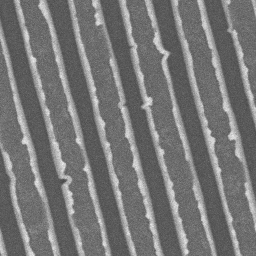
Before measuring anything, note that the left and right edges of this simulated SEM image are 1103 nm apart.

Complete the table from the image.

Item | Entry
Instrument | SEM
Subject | parallel lines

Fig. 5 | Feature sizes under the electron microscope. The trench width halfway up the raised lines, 87.3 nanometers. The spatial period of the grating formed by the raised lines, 0.218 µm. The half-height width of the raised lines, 30.8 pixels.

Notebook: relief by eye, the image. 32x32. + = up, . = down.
..++++...+++...++++...+++...++++
..++++...++++..++++...++++..++++
...+++...++++...+++...++++...+++
...++++..++++...++++..++++...+++
...++++..++++...++++...+++...+++
+..++++...++++..++++...++++..+++
+..++++...++++...++++..++++...++
+...++++..++++...++++..++++...++
+...++++...++++..++++...+++...++
++..++++...++++..++++...++++..++
++...+++...++++..++++...++++...+
++...++++..++++...++++..++++...+
++...++++...++++..++++...+++...+
+++..++++...++++..++++...++++..+
+++...+++...++++...+++...++++...
+++...++++..++++...++++..++++...
+++...++++..++++...++++...++++..
++++..++++...++++..++++...++++..
++++...+++...++++...++++..++++..
++++...++++..++++...++++..++++..
.+++...++++...+++...++++...++++.
.++++..++++...++++..++++...++++.
.++++...++++..++++...++++..++++.
.++++...++++..++++...++++..++++.
..++++..++++...+++...++++...++++
..++++..++++...++++..++++...++++
..++++...+++...++++...++++..++++
..++++...++++..++++...++++...+++
...+++...++++...+++...++++...+++
...++++..++++...++++..++++...+++
...++++...+++...++++...++++..+++
...++++...++++..++++...++++..+++